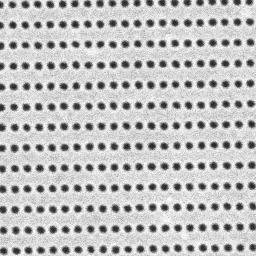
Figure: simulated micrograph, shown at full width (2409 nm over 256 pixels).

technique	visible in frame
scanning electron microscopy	a regular array of holes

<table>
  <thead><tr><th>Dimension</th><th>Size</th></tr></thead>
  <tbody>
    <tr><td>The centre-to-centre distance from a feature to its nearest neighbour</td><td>115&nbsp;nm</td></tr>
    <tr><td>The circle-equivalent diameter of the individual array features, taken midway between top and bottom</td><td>0.0791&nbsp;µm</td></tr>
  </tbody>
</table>